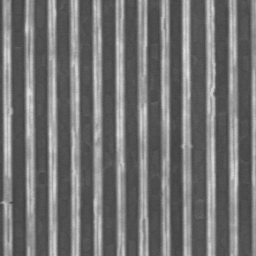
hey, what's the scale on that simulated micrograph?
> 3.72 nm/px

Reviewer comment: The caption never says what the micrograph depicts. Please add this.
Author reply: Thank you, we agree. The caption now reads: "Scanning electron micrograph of parallel lines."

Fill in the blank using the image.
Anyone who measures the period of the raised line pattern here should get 84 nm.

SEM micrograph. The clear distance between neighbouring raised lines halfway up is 52.5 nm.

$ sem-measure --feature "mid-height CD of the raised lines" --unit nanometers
31.1